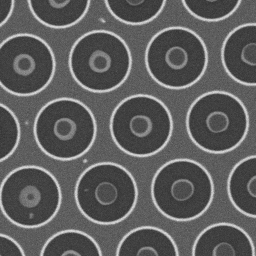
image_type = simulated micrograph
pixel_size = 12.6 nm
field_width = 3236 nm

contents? an array of small figures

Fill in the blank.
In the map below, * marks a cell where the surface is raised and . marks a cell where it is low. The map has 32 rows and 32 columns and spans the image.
..**...*...**...*...***.......**
.***.......***......****.....***
.****.....*****....*************
******************************..
**..*******...*****......****...
......****......***......***...*
......***.......**...**...**..**
..**...**...*...**...**...**...*
..**...**...*...***.......**....
......***.......***......****...
......****.....*****....*******.
**..****************************
********.*******....*****.....**
.*****.....****......***......**
..***......***.......***..**...*
..**...**...**..***..**...**...*
..**...**...**...*...***.......*
..***.......**.......***......**
..***......****.....*****....***
.******...**********************
*************.*******....*****..
**....*****.....****......***...
*......***.......**.......***...
.......***..**...**...**..***..*
...*...***..***..**...**..***...
.......***.......***......***...
*......***......****.....*****..
*.....******...*****************
******************.*******....**
*******....*****.....****......*
..****......***.......**.......*
...**.......***..**...**...**...